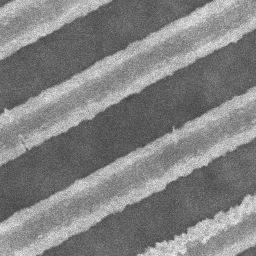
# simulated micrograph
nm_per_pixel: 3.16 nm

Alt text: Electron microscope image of one or a few lines or trenches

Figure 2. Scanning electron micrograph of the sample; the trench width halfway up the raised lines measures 197 nanometres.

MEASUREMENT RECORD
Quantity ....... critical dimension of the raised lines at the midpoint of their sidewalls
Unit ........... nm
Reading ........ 103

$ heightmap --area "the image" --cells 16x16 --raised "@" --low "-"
-@@@@---------@@
@@@---------@@@@
@---------@@@@--
--------@@@@----
------@@@@------
----@@@@--------
--@@@@---------@
@@@@---------@@@
@@@--------@@@@-
@--------@@@@---
-------@@@@@----
-----@@@@@------
---@@@@@--------
--@@@@---------@
@@@@--------@@@@
@@---------@@@@-